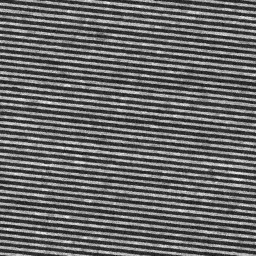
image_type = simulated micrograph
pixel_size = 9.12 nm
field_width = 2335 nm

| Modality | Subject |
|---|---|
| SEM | parallel lines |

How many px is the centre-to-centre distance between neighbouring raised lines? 6.21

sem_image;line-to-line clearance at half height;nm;34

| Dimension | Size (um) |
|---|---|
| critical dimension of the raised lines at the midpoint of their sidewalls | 0.0192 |